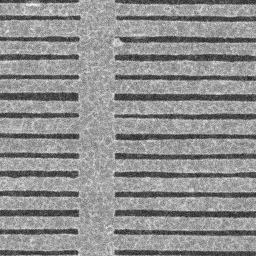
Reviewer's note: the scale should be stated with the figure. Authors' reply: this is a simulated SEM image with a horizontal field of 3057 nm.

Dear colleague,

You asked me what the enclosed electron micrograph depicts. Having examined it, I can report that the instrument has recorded parallel lines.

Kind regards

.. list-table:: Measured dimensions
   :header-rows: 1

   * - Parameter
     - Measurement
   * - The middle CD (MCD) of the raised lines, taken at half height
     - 154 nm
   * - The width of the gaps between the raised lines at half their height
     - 0.0716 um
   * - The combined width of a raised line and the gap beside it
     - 232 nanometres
